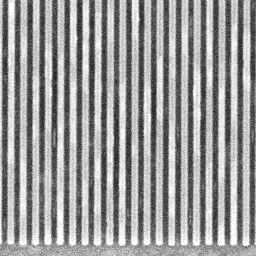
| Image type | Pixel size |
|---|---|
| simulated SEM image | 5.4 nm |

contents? parallel lines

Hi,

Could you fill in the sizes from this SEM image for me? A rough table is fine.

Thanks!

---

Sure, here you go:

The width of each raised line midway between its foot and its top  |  27.7 nm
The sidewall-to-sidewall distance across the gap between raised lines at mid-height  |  36.4 nanometres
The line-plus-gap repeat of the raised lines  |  0.0669 microns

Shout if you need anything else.